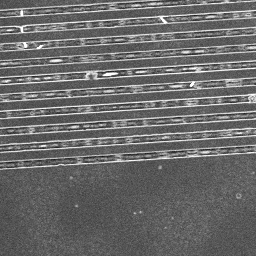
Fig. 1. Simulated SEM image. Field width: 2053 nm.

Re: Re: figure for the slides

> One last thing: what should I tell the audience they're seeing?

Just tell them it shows parallel lines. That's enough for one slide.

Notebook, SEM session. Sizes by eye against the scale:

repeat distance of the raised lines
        0.135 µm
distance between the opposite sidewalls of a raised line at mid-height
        83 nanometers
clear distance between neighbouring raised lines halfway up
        6.86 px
